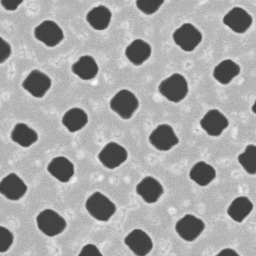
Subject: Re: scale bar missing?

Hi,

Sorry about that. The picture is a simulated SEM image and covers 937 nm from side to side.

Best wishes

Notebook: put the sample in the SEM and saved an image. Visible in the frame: a regular array of holes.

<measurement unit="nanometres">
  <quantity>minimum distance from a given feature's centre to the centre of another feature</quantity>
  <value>188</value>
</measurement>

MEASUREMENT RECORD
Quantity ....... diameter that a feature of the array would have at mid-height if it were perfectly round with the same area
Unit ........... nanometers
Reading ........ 89.1